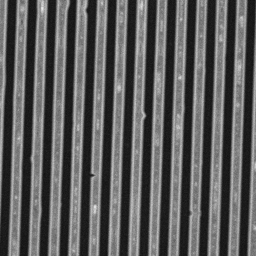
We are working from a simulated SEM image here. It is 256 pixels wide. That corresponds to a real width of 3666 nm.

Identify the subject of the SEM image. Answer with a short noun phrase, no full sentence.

parallel lines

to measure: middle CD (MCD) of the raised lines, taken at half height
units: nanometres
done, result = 132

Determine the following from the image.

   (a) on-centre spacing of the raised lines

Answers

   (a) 286 nanometres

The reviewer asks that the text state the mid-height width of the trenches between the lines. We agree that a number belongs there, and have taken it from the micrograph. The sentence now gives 0.159 micrometres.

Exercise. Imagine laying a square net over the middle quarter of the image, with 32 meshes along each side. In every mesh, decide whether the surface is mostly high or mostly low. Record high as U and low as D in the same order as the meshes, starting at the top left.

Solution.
DDDUUDDDUUDDDUUDDDUUDDDUUDDDUUDD
DDDUUDDDUUDDDUUDDDUUDDDUUDDDUUDD
DDDUUDDDUUDDDUUDDDUUDDDUUDDDUUDD
DDDUUDDDUUDDDUUDDDUUDDDUUDDDUUDD
DDDUUDDDUUDDDUUDDDUUDDDUUDDDUUDD
DDDUUDDDUUDDDUUDDDUUDDDUUDDDUUDD
DDDUUDDDUUDDDUUDDDUUDDDUUDDDUUDD
DDDUUDDDUUDDDUUDDDUUDDDUUDDDUUDD
DDDUUDDDUUDDDUUDDDUUDDDUUDDDUUDD
DDDUUDDDUUDDDUUDDDUUDDDUUDDDUUDD
DDDUUDDDUUDDDUUDDDUUDDDUUDDDUUDD
DDDUUDDDUUDDDUUDDDUUDDDUUDDDUUDD
DDDUUDDDUDDDDUUDDDUUDDUUUDDDUUDD
DDUUUDDDUDDDDUUDDDUUDDUUUDDDUUDD
DDDUUDDDUDDDUUUDDDUUDDUUUDDDUUDD
DDDUUDDDUDDDUUDDDDUDDDUUDDDUUUDD
DDDUDDDUUDDDUUDDDUUDDDUUDDDUUUDD
DDDUDDDUUDDDUUDDDUUDDDUUDDDUUUDD
DDDUDDDUUDDDUUDDDUUDDDUUDDDUUDDD
DDDUDDDUUDDDUUDDDUUDDDUUDDDUUDDD
DDUUDDDUUDDDUUDDDUUDDDUUDDDUUDDD
DDUUDDDUUDDDUUDDDUUDDDUUDDDUUDDD
DDUUDDDUUDDDUUDDDUUDDDUUDDDUUDDD
DDUUDDDUUDDDUUDDDUUDDDUUDDDUUDDD
DDUUDDDUUDDDUUDDDUUDDDUUDDDUUDDD
DDUUDDDUUDDDUUDDDUUDDDUUDDDUUDDD
DDUUDDDUUDDDUUDDDUUDDDUUDDDUUDDD
DDUUDDDUUDDDUUDDDUUDDDUUDDDUUDDD
DDUUDDDUUDDDUUDDDUUDDDUUDDDUUDDD
DDUUDDDUUDDDUUDDDUUDDDUUDDDUUDDD
DDUUDDDUUDDDUUDDDUUDDDUUDDDUUDDD
DDUUDDDUUDDDUUDDDUUDDDUUDDDUUDDD